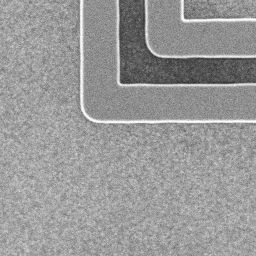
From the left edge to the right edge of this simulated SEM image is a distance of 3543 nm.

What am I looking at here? groups of lines, slits or small figures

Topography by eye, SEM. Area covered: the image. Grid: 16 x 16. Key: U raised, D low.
DDDDDUUDDUUDDDDD
DDDDDUUDDUUUUUUU
DDDDDUUDDUUUUUUU
DDDDDUUDDDUUUUUU
DDDDDUUDDDDDDDDD
DDDDDUUUUUUUUUUU
DDDDDUUUUUUUUUUU
DDDDDDUUUUUUUUUU
DDDDDDDDDDDDDDDD
DDDDDDDDDDDDDDDD
DDDDDDDDDDDDDDDD
DDDDDDDDDDDDDDDD
DDDDDDDDDDDDDDDD
DDDDDDDDDDDDDDDD
DDDDDDDDDDDDDDDD
DDDDDDDDDDDDDDDD